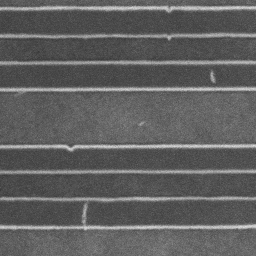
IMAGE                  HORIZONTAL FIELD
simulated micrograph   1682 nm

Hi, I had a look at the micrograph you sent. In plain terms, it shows one or a few lines or trenches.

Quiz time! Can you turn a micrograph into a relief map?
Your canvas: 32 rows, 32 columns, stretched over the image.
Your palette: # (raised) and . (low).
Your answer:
................................
################################
################################
################################
######################..........
................................
................................
................................
################################
################################
################################
................................
................................
................................
................................
................................
................................
................................
################################
################################
################################
#########.......................
................................
................................
................................
################################
################################
################################
##........#.....................
................................
................................
................................